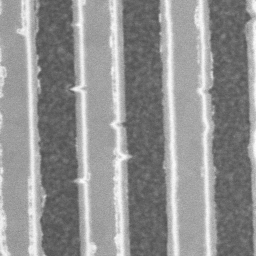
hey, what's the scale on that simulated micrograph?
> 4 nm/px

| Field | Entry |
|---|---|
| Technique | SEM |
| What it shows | one or a few lines or trenches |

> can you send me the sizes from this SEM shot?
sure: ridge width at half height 135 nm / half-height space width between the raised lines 211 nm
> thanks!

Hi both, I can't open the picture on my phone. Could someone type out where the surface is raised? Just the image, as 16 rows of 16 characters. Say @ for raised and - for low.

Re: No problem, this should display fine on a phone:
@@---@@---@@@---
@@---@@----@@---
@@---@@----@@---
@@---@@----@@---
@@---@@----@@---
@@---@@----@@---
@@---@@----@@---
@@---@@----@@---
@@---@@----@@---
@@---@@----@@---
@@---@@----@@---
@@---@@----@@---
@@---@@@---@@---
@@---@@@---@@---
@@---@@@---@@---
@@---@@@---@@---